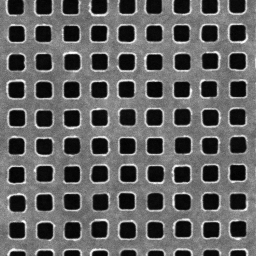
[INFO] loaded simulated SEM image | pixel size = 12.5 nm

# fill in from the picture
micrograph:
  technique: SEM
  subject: a regular array of holes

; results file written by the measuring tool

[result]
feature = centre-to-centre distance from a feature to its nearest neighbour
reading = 341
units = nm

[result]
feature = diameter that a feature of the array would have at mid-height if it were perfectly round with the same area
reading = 224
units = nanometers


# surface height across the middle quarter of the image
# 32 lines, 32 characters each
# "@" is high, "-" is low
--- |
----@@@----@@@----@@-----@@-----
@--@@@@@--@@@@---@@@@---@@@@@--@
@@@@@@@@@@@@@@@@@@@@@@@@@@@@@@@@
@@@@@@@@@@@@@@@@@@@@@@@@@@@@@@@@
---@@@@@--@@@@---@@@@---@@@@---@
----@@@----@@-----@@-----@@-----
----@@@----@@-----@@-----@@-----
----@@@----@@@----@@@----@@----@
@--@@@@@--@@@@@--@@@@@--@@@@--@@
@@@@@@@@@@@@@@@@@@@@@@@@@@@@@@@@
@@@@@@@@@@@@@@@@@@@@@@@@@@@@@@@@
@--@@@@@--@@@@----@@@---@@@@---@
----@@@----@@@----@@@----@@-----
----@@@----@@@----@@@----@@-----
----@@@----@@@----@@@----@@@---@
@--@@@@@--@@@@@@@@@@@---@@@@--@@
@@@@@@@@@@@@@@@@@@@@@@@@@@@@@@@@
@@@@@@@@@@@@@@@@@@@@@@@@@@@@@@@@
@---@@@@--@@@@@-@@@@@---@@@@---@
----@@@----@@@----@@@----@@@----
----@@@----@@@----@@@----@@@----
----@@@----@@@----@@@----@@@----
@--@@@@---@@@@@--@@@@---@@@@@--@
@@@@@@@@@@@@@@@@@@@@@@@@@@@@@@@@
@@@@@@@@@@@@@@@@@@@@@@@@@@@@@@@@
@--@@@@----@@@@--@@@@@--@@@@@@@@
----@@@----@@@----@@@----@@-----
----@@@----@@@----@@@----@@-----
----@@@----@@@----@@@----@@-----
----@@@---@@@@@--@@@@@--@@@@---@
@@@@@@@@@@@@@@@@@@@@@@@@@@@@@@@@
@@@@@@@@@@@@@@@@@@@@@@@@@@@@@@@@